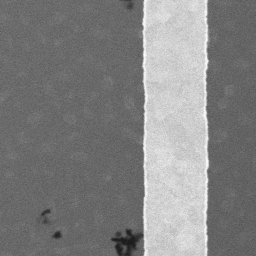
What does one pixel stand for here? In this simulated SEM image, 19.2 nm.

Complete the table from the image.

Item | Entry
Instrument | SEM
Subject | one or a few lines or trenches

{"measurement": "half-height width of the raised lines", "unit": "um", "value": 1.17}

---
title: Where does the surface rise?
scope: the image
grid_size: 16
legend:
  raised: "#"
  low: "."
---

.........####...
.........####...
.........####...
.........####...
.........####...
.........####...
.........####...
.........####...
.........####...
.........####...
.........####...
.........####...
.........####...
.........####...
.........####...
.........####...